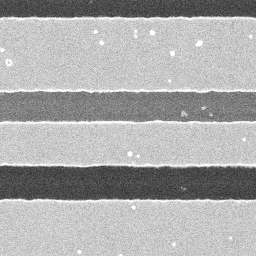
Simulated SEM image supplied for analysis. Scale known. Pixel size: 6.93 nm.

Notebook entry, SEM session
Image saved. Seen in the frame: lines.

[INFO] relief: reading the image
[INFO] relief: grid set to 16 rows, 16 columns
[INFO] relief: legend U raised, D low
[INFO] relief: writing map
DDDDDDDDDDDDDDDD
UUUUUUUUUUUUUUUU
UUUUUUUUUUUUUUUU
UUUUUUUUUUUUUUUU
UUUUUUUUUUUUUUUU
UUUUUUUUUUUUUUUU
DDDDDDDDDDDDDDDD
DDDDDDDDDDDDDDDD
UUUUUUUUUUUUUUUU
UUUUUUUUUUUUUUUU
DDDDDDDDDDDDDDDD
DDDDDDDDDDDDDDDD
UDUDDDDDDDDDDDDD
UUUUUUUUUUUUUUUU
UUUUUUUUUUUUUUUU
UUUUUUUUUUUUUUUU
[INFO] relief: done